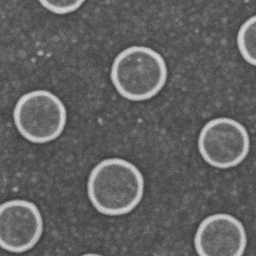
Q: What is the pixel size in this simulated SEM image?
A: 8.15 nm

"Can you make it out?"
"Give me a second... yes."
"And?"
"raised bodies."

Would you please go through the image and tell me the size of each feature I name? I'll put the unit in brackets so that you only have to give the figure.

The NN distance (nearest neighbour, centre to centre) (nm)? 860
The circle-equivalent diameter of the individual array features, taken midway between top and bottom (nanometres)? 399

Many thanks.